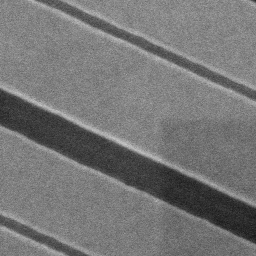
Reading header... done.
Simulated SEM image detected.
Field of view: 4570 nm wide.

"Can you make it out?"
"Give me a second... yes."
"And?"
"lines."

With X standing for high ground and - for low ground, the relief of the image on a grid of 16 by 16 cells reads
XXXXXXXXXXXXXXXX
XXXXXXXXXXXXXXXX
XXXXXXXXXXXXXXXX
XXXXXXXXXXXXXXXX
XXXXXXXXXXXXXXXX
XXXXXXXXXXXXXXXX
--XXXXXXXXXXXXXX
-----XXXXXXXXXXX
X------XXXXXXXXX
XXX------XXXXXXX
XXXXXX-----XXXXX
XXXXXXXX-----XXX
XXXXXXXXXX-----X
XXXXXXXXXXXX----
XXXXXXXXXXXXXX--
XXXXXXXXXXXXXXXX